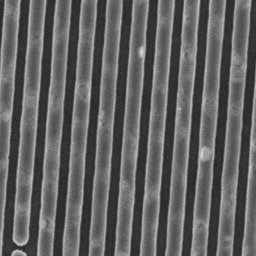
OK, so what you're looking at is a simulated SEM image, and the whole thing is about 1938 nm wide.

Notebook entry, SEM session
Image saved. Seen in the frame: parallel lines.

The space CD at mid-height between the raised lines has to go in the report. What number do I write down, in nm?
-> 76.4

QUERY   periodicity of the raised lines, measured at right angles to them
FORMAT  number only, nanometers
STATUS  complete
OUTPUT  194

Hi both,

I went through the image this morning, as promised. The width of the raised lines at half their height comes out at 15.1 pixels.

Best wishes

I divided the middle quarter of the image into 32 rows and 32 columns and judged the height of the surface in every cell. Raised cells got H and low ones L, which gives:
LLLHHHHLLLHHHLLLHHHHLLLHHHLLLHHH
HLLHHHHLLLHHHLLLHHHHLLLHHHLLLHHH
LLLHHHHLLLHHHLLLHHHHLLLHHHLLLHHH
LLLHHHHLLHHHHLLLHHHHLLHHHHLLLHHH
LLLHHHHLLHHHHLLLHHHLLLHHHHLLLHHH
LLLHHHHLLHHHHLLLHHHHLLHHHHLLLHHH
LLLHHHHLLHHHHLLLHHHHLLHHHHLLLHHH
LLLHHHLLLHHHHLLLHHHLLLHHHHLLLHHH
LLLHHHLLLHHHHLLLHHHLLLHHHHLLHHHH
LLLHHHLLLHHHHLLLHHHLLLHHHHLLHHHH
LLLHHHLLLHHHHLLHHHHLLLHHHHLLHHHH
LLLHHHLLLHHHLLLHHHHLLLHHHLLLHHHH
LLHHHHLLLHHHLLLHHHHLLLHHHLLLHHHH
LLHHHHLLLHHHLLLHHHHLLLHHHLLLHHHH
LLHHHHLLLHHHLLLHHHHLLLHHHLLLHHHH
LLHHHHLLLHHHLLLHHHHLLLHHHLLLHHHH
LLHHHHLLHHHHLLLHHHHLLLHHHLLLHHHL
LLHHHHLLHHHHLLLHHHHLLHHHHLLLHHHL
LLHHHHLLHHHHLLLHHHHLLHHHHLLLHHHL
LLHHHHLLHHHHLLLHHHLLLHHHHLLLHHHL
LLHHHLLLHHHHLLLHHHLLLHHHHLLLHHHL
LLHHHLLLHHHHLLLHHHLLLHHHHLLHHHHL
LLHHHLLLHHHHLLLHHHLLLHHHLLLHHHHL
LLHHHLLLHHHHLLHHHHLLLHHHHLLHHHHL
LLHHHLLLHHHLLLHHHHLLLHHHHLLHHHHL
LHHHHLLLHHHHLLHHHHLLLHHHLLLHHHHL
LHHHHLLLHHHHLLHHHHLLLHHHLLLHHHHL
LHHHHLLLHHHLLLHHHHLLLHHHLLLHHHHL
LHHHHLLLHHHLLLHHHHLLHHHHLLLHHHHL
LHHHHLLLHHHLLLHHHHLLLHHHLLLHHHLL
LHHHHLLHHHHLLLHHHHLLHHHHLLLHHHLL
LHHHHLLHHHHLLLHHHLLLHHHHLLLHHHLL